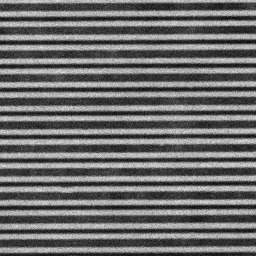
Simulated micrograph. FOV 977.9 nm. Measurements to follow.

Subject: parallel lines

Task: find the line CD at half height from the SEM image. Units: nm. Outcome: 21.5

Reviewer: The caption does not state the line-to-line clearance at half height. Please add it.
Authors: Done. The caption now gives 28.7 nm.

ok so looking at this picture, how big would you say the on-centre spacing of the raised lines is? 0.0451 µm